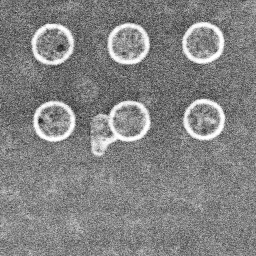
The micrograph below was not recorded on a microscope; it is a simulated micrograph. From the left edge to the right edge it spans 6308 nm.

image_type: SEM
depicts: raised bodies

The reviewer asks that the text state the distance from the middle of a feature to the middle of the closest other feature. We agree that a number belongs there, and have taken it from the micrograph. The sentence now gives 74.7 px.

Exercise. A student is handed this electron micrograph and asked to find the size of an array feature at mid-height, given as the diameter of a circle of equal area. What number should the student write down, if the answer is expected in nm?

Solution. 923